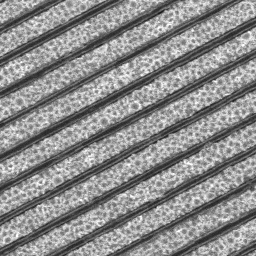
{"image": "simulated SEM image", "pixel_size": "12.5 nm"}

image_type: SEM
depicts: parallel lines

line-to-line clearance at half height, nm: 285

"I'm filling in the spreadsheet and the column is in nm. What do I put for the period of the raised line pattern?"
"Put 351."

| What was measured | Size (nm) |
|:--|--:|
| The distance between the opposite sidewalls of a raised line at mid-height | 57.8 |